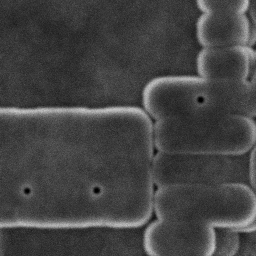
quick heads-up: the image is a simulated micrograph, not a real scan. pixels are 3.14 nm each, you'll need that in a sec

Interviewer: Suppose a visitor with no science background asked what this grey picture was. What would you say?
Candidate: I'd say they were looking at wiring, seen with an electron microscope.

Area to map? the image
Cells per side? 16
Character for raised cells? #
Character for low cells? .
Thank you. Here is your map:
.............##.
............###.
.............##.
.............##.
............####
.........#######
.........#######
################
################
################
################
################
################
################
.........####...
.........####...